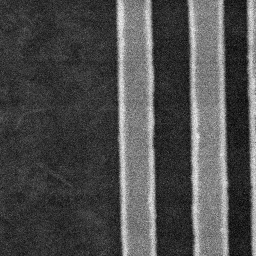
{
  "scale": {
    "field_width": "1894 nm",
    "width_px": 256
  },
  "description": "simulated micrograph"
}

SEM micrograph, one or a few lines or trenches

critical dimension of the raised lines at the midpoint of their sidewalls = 213 nanometres